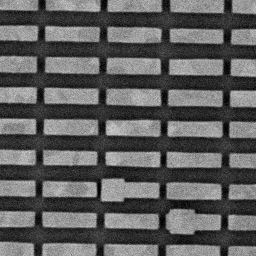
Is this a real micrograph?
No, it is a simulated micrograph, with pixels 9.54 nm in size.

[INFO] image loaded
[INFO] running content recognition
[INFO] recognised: wiring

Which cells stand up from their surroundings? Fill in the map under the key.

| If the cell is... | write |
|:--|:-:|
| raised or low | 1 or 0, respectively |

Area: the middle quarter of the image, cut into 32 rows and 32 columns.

11111111100111111111111100111111
11111111100111111111111100111111
00000000000000000000000000000111
00000000000000000000000000000000
00000000000000000000000000000000
00000000000000000000000000000000
11111111000111111111110000000000
11111111000111111111111100111111
11111111000111111111111100111111
11111111000111111111111100111111
00000000000000000000000000000000
00000000000000000000000000000000
00000000000000000000000000000000
00000000000000000000000000000000
11111111000111111111111100111111
11111111000111111111111100111111
11111111000111111111111100111111
11111111000111111111111100111111
00000000000000000000000000000000
00000000000000000000000000000000
00000000000000000000000000000000
00000000000000000000000000000000
11111111000111111111111100111111
11111111000111111111111100111111
11111111000111111111111100111111
00000000000000001111111100111111
00000000000000000000000000000000
00000000000000000000000000000000
00000000000000000000000000000000
11000000001111110000000000000000
11111111001111111111111100111111
11111111011111111111111100111111